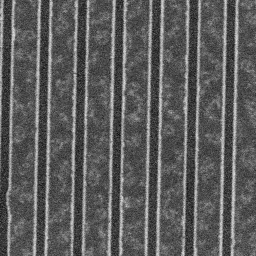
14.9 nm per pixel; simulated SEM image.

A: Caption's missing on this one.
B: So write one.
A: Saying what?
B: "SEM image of parallel lines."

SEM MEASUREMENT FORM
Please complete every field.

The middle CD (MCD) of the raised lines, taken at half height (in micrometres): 0.389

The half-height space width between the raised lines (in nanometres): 160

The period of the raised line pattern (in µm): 0.555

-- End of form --